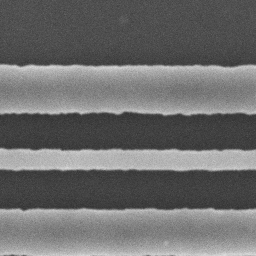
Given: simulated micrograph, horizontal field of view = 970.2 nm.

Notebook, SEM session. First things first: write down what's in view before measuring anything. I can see lines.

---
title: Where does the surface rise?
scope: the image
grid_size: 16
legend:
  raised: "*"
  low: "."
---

................
................
................
................
****************
****************
****************
................
................
****************
****************
................
................
****************
****************
****************